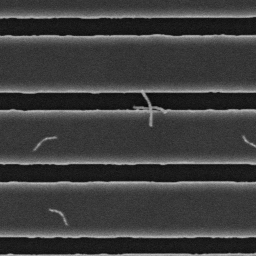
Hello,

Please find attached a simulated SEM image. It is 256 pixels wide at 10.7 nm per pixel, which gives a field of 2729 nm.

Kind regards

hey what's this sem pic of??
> lines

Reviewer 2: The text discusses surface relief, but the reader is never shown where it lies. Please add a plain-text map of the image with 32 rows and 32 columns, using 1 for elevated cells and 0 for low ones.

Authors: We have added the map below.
11111111111111111111111111111111
11111111111111111111111111111111
00000000000000000000000000000000
00000000000000000000000000000000
11000110100111111111111111111111
11111111111111111111111111111111
11111111111111111111111111111111
11111111111111111111111111111111
11111111111111111111111111111111
11111111111111111111111111111111
11111111111111111111111111111111
11111111111111111111111111011111
00000000000000000000000000000000
00000000000000000001000000000000
11111111111111111111111111111111
11111111111111111111111111111111
11111111111111111111111111111111
11111111111111111111111111111111
11111111111111111111111111111111
11111111111111111111111111111111
00110001100000111000100000000001
00000000000000000000000000000000
00000000000000000000000000000000
11111111111111111111111111111111
11111111111111111111111111111111
11111111111111111111111111111111
11111111111111111111111111111111
11111111111111111111111111111111
11111111111111111111111111111111
11111111111111111111111111111111
00000000000000000000000000000000
00000000000000000000000000000000